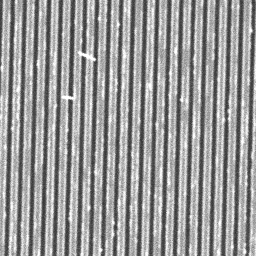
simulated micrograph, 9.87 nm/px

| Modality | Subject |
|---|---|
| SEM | parallel lines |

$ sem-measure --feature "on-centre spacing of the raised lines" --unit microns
0.119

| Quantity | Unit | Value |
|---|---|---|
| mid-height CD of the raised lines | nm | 69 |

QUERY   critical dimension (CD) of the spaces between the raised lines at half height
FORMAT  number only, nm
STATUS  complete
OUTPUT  51.8